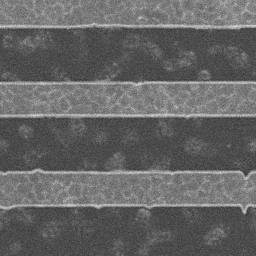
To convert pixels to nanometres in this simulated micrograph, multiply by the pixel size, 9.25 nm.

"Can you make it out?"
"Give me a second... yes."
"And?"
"one or a few lines or trenches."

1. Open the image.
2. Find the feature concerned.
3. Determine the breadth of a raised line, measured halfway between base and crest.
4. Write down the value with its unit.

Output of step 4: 303 nanometres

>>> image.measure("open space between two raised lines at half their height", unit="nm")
524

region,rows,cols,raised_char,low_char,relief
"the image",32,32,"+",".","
++++++++++++++++++++++++++++++++
++++++++++++++++++++++++++++++++
++++++++++++++++++++++++++++++++
................................
................................
................................
................................
................................
................................
.........................+......
+++++++++++++++++.++++++++++++++
++++++++++++++++++++++++++++++++
++++++++++++++++++++++++++++++++
++++++++++++++++++++++++++++++++
.......................+........
................................
................................
................................
................................
................................
................................
....+...........................
++++++++++++++++++++++++++++++++
++++++++++++++++++++++++++++++++
++++++++++++++++++++++++++++++++
++++++++++++++++++++++++++++++++
................................
................................
................................
................................
................................
................................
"